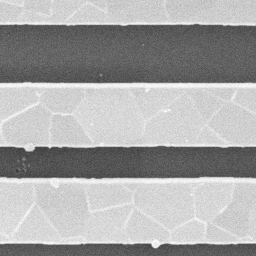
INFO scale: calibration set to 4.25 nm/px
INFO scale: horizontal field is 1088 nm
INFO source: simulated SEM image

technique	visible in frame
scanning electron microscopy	lines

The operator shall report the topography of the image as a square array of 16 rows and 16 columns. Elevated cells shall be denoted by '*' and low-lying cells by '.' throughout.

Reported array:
****************
****************
................
................
................
****************
****************
****************
****************
................
................
****************
****************
****************
****************
................